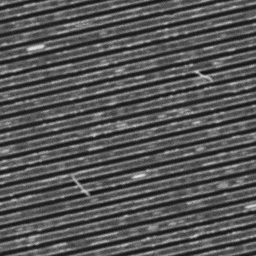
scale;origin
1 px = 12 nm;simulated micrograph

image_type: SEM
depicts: parallel lines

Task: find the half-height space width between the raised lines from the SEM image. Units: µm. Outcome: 0.0615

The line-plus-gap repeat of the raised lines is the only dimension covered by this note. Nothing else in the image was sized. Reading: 0.16 µm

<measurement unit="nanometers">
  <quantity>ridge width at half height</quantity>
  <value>101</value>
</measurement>